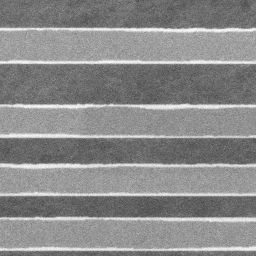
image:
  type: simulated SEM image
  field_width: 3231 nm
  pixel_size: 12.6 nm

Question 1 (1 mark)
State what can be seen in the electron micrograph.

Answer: lines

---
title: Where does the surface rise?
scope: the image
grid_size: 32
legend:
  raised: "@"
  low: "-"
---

--------------------------------
--------------------------------
--------------------------------
--------------------------------
@@@@@@@@@@@@@@@@@@@@@@@@@@@@@@@@
@@@@@@@@@@@@@@@@@@@@@@@@@@@@@@@@
@@@@@@@@@@@@@@@@@@@@@@@@@@@@@@@@
@@@@@@@@@@@@@@@@@@@@@@@@@@@@@@@@
--------------------------------
--------------------------------
--------------------------------
--------------------------------
--------------------------------
@@@@@@@@@@@@@@@@@@@@@@@@@@@@@@@@
@@@@@@@@@@@@@@@@@@@@@@@@@@@@@@@@
@@@@@@@@@@@@@@@@@@@@@@@@@@@@@@@@
@@@@@@@@@@@@@@@@@@@@@@@@@@@@@@@@
--------------------------------
--------------------------------
--------------------------------
--------------------------------
@@@@@@@@@@@@@@@@@@@@@@@@@@@@@@@@
@@@@@@@@@@@@@@@@@@@@@@@@@@@@@@@@
@@@@@@@@@@@@@@@@@@@@@@@@@@@@@@@@
--------------------------------
--------------------------------
--------------------------------
@@@@@@@@@@@@@@@@@@@@@@@@@@@@@@@@
@@@@@@@@@@@@@@@@@@@@@@@@@@@@@@@@
@@@@@@@@@@@@@@@@@@@@@@@@@@@@@@@@
@@@@@@@@@@@@@@@@@@@@@@@@@@@@@@@@
--------------------------------